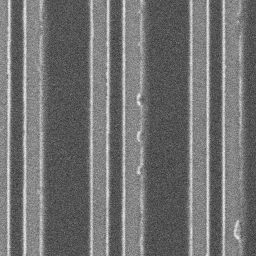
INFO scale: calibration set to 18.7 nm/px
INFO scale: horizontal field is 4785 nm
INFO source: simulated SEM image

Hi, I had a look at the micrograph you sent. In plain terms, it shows lines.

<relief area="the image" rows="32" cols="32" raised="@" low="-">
-@@--@@@@@@---@@--@@@@@@--@@--@@
-@@--@@@@@@---@@--@@@@@@--@@--@@
-@@--@@@@@@---@@--@@@@@@--@@--@@
-@@--@@@@@@@--@@--@@@@@@--@@--@@
-@@--@@@@@@@--@@--@@@@@@--@@--@@
-@@--@@@@@@---@@--@@@@@@--@@--@@
-@@--@@@@@@---@@--@@@@@@--@@--@@
-@@--@@@@@@---@@--@@@@@@--@@--@@
-@@--@@@@@@--@@@--@@@@@@--@@--@@
-@@--@@@@@@--@@@--@@@@@@--@@--@@
-@@--@@@@@@--@@@--@@@@@@--@@--@@
-@@--@@@@@@---@@--@@@@@@--@@--@@
-@@--@@@@@@---@@-@@@@@@@--@@--@@
-@@--@@@@@@--@@@--@@@@@@--@@--@@
-@@--@@@@@@--@@@--@@@@@@--@@--@@
-@@--@@@@@@--@@@--@@@@@@--@@--@@
-@@--@@@@@@--@@@--@@@@@@--@@--@@
-@@--@@@@@@--@@@-@@@@@@@--@@--@@
-@@--@@@@@@--@@@--@@@@@@--@@--@@
-@@--@@@@@@--@@@--@@@@@@--@@--@@
-@@--@@@@@@--@@@--@@@@@@--@@--@@
-@@--@@@@@@--@@@-@@@@@@@--@@--@@
-@@--@@@@@@--@@@--@@@@@@--@@--@@
-@@--@@@@@@--@@@--@@@@@@--@@--@@
-@@--@@@@@@--@@@--@@@@@@--@@--@@
-@@--@@@@@@--@@@--@@@@@@--@@--@@
-@@--@@@@@@--@@@--@@@@@@--@@--@@
-@@--@@@@@@--@@@--@@@@@@--@@--@@
-@@--@@@@@@--@@@--@@@@@@--@@-@@@
-@@--@@@@@@--@@@--@@@@@@--@@-@@@
-@@--@@@@@@--@@@--@@@@@@--@@--@@
-@@--@@@@@@--@@@--@@@@@@--@@--@@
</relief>